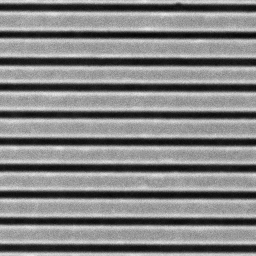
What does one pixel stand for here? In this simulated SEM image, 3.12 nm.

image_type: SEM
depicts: parallel lines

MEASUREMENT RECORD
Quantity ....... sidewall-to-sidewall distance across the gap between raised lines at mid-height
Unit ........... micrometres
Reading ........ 0.0257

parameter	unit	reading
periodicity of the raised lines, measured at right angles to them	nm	83.2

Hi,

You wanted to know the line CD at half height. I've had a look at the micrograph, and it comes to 58.1 nm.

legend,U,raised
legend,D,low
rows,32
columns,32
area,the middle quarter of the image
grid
DDDDDDDDDDDDDDDDDDDDDDDDDDDDDDDD
UUUUUUUUUUUUUUUUUUUUUUUUUUUUUUUU
UUUUUUUUUUUUUUUUUUUUUUUUUUUUUUUU
UUUUUUUUUUUUUUUUUUUUUUUUUUUUUUUU
UUUUUUUUUUUUUUUUUUUUUUUUUUUUUUUU
DDDDDDDDDDDDDDDDDDDDDDDDDDDDDDDD
DDDDDDDDDDDDDDDDDDDDDDDDDDDDDDDD
UUUUUUUUUUUUUUUUUUUUUUUUUUUUUUUU
UUUUUUUUUUUUUUUUUUUUUUUUUUUUUUUU
UUUUUUUUUUUUUUUUUUUUUUUUUUUUUUUU
UUUUUUUUUUUUUUUUUUUUUUUUUUUUUUUU
DUUUUUUUUUUUUUUUUUUUUUUUUUUUUUUU
DDDDDDDDDDDDDDDDDDDDDDDDDDDDDDDD
DDDDDDDDDDDDDDDDDDDDDDDDDDDDDDDD
UUUUUUUUUUUUUUUUUUUUUUUUUUUUUUUU
UUUUUUUUUUUUUUUUUUUUUUUUUUUUUUUU
UUUUUUUUUUUUUUUUUUUUUUUUUUUUUUUU
UUUUUUUUUUUUUUUUUUUUUUUUUUUUUUUU
DDDDDDDDDDDDDDDDDDDDDDDDDDDDDDDD
DDDDDDDDDDDDDDDDDDDDDDDDDDDDDDDD
DDDDDDDDDDDDDDDDDDDDDDDDDDDDDDDD
UUUUUUUUUUUUUUUUUUUUUUUUUUUUUUUU
UUUUUUUUUUUUUUUUUUUUUUUUUUUUUUUU
UUUUUUUUUUUUUUUUUUUUUUUUUUUUUUUU
UUUUUUUUUUUUUUUUUUUUUUUUUUUUUUUU
DDDDDDDDDDDDDDDDDDDDDDDDDDDDDDDD
DDDDDDDDDDDDDDDDDDDDDDDDDDDDDDDD
UUUUUUUUUUUUUUUUUUUUUUUUUUUUUUUU
UUUUUUUUUUUUUUUUUUUUUUUUUUUUUUUU
UUUUUUUUUUUUUUUUUUUUUUUUUUUUUUUU
UUUUUUUUUUUUUUUUUUUUUUUUUUUUUUUU
DDDDDDDDDDDDUDDUUUUUUUUUUUUUUUUU